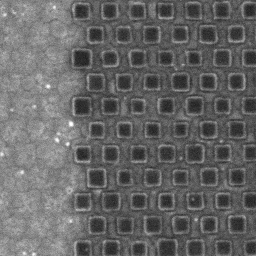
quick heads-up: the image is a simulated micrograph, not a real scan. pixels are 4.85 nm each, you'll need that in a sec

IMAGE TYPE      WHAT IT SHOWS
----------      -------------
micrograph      a regular array of raised bodies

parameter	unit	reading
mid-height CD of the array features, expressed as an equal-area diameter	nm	87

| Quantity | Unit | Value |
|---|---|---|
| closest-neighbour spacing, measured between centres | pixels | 27.3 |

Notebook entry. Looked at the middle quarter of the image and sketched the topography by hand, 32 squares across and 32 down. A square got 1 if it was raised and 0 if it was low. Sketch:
00111110001110000111000000000000
00000000000000000000000000000000
00000000000000000000000000011110
00000011110001111000111100011110
00000011110001111000111100011110
00000011110001111000111100011110
00000011110000111000000000011110
00000000000000000000000000000000
00000000000000000000000000000001
00111110001111000111000011110001
00111110001111000111000011110001
00111110001111000111000011110001
00011110001110000000000000000001
00000000000000000000000000000000
00000000000000000000000000000000
00000011110001111000111100001110
00000011110001111000111100001110
00000011110001111000111100001110
00000000000000000000000000000000
00000000000000000000000000000000
00000000000000000000000000000001
00011100001111000111000011110001
00011100001111000111000011110001
00011100001111000111000011110001
00000000001110000000000000000001
00000000000000000000000000000000
00000011110000000000000000000000
00000011110001111000111100011110
00000011110001111000111100011110
00000011110001111000111100011110
00000011110000000000000000000000
00000000000000000000000000000000